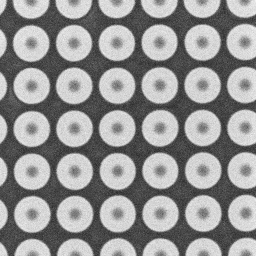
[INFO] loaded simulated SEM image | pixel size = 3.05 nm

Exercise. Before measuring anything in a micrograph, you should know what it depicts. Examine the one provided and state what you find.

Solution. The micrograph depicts an array of small figures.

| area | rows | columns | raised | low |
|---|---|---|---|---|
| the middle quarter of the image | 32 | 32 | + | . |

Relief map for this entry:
................................
+++++......++++.......++++......
++++++....+++++++....++++++....+
++++++...++++++++...++++++++...+
+++++++..++++++++...++++++++..++
+++++++..+++++++++..++++++++..++
+++++++..++++++++...++++++++..++
++++++...++++++++...++++++++...+
++++++....+++++++....++++++.....
.++++.......+++........++.......
................................
................................
+++++......+++++.....++++++.....
++++++....+++++++...++++++++...+
+++++++..+++++++++..++++++++..++
+++++++..+++++++++..++++++++..++
+++++++..+++++++++..++++++++..++
+++++++..+++++++++..++++++++...+
++++++....+++++++...++++++++...+
++++++....++++++.....++++++.....
..++........++.........++.......
................................
..............+.......++++......
++++++....++++++.....++++++.....
+++++++...+++++++...++++++++...+
+++++++..+++++++++..++++++++...+
+++++++..+++++++++..++++++++...+
+++++++..+++++++++..++++++++...+
+++++++..++++++++...++++++++...+
++++++....+++++++....+++++++...+
+++++......+++++......+++++.....
................................